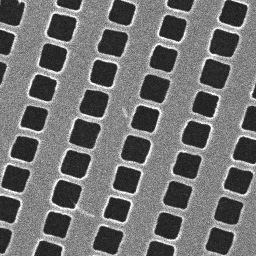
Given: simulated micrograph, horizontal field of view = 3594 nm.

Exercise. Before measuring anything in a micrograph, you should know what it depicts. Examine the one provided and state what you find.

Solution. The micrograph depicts a regular array of holes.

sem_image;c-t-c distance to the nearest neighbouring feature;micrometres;0.443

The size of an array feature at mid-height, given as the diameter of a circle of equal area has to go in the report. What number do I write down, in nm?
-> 382